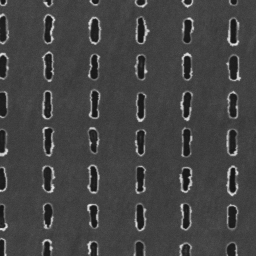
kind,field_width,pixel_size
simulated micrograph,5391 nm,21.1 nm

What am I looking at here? a regular array of holes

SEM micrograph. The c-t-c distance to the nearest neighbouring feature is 0.76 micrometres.